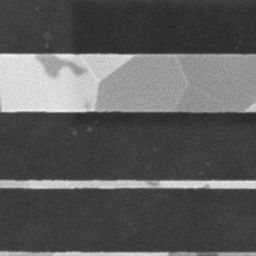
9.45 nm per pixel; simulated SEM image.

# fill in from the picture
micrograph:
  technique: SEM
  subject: lines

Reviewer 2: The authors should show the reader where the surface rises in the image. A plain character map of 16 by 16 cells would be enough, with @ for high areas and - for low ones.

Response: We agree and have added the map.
----------------
----------------
----------------
@@@@@@@@@@@@@@@@
@@@@@@@@@@@@@@@@
@@@@@@@@@@@@@@@@
@@@@@@@@@@@@@@@@
----------------
----------------
----------------
----------------
----------------
----------------
----------------
----------------
----------------